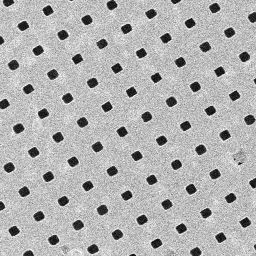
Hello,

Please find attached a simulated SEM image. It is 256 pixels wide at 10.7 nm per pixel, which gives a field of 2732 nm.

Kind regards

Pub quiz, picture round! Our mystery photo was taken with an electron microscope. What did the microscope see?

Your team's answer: a regular array of holes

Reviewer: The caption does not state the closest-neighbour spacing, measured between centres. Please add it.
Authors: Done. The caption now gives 301 nanometres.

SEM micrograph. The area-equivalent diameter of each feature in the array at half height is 112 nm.